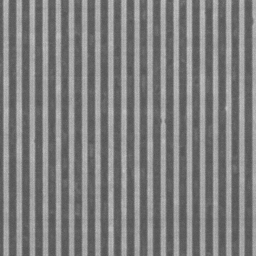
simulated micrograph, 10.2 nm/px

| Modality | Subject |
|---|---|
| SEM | parallel lines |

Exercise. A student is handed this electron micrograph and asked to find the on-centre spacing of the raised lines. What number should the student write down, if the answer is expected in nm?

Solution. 134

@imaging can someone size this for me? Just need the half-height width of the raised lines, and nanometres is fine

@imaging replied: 43.4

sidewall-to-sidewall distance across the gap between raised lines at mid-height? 0.088 microns